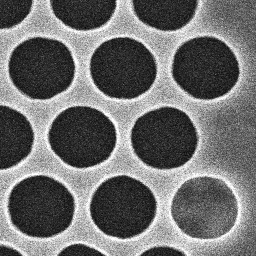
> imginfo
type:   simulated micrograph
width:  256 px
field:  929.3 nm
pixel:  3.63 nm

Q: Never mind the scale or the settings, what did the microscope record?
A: holes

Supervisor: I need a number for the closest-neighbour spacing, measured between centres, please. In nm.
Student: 292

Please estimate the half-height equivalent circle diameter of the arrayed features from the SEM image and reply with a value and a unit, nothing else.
236 nm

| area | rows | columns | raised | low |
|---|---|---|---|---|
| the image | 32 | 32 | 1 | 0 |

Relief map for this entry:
00001100000000010000000001111111
00001110000000111000000001111111
00011110000000111000000011111111
00111111100011111110000111111111
11111111111111111111111111111111
11000000111110000011111000001111
10000000011100000001110000000111
10000000011000000001110000000011
10000000011000000000100000000011
10000000011000000001110000000011
11000000011100000001110000000111
11100000111110000011111000000111
11110011111111111111111111111111
00111111100011111111001111111111
00011110000001111100000111111111
00001100000000111000000011111111
00001100000000110000000001111111
00001100000000010000000001111111
00001100000000111000000001111111
00011110000000111000000011111111
00111111000011111100000111111111
11111111111111111111111111111111
11100001111110000111111111111111
11000000111100000001111111111111
10000000011100000001111111111111
10000000011000000000111111111111
10000000011000000001111111111111
10000000011100000001111111111111
11000000111100000011111111111111
11110001111111000111111111111111
11111111101111111111111111111111
00111111000001111100000111111111